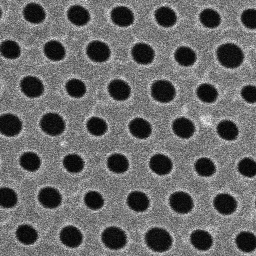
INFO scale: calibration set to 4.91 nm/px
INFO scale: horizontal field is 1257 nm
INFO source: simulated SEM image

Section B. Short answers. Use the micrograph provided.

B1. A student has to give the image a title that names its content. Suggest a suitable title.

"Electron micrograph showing a regular array of holes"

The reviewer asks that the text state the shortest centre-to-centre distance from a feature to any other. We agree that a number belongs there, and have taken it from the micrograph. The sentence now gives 207 nm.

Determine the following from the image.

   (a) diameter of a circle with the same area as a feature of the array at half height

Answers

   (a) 101 nanometers